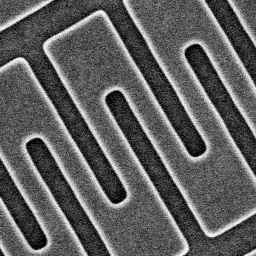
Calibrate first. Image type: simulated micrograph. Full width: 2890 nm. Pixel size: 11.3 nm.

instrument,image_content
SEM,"groups of lines, slits or small figures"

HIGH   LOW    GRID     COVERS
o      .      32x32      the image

oooooo..........oooooooooo...ooo
oooo........o...oooooooooo...ooo
oo........oooo...oooooooooo...oo
o........ooooo...ooooooooooo...o
.......oooooooo...oooooooooo...o
......ooooooooo...oooooo.oooo...
......oooooooooo...oooo...ooo...
..o...ooooooooooo...ooo...oooo..
oooo...oooooooooo...oooo...oooo.
oooo...ooooooooooo...ooo...oooo.
ooooo...oooooooooo...oooo...oooo
oooooo...ooooo.oooo...oooo...ooo
oooooo...oooo...oooo...ooo...ooo
ooooooo...oooo..oooo...oooo...oo
ooooooo...oooo...oooo...ooo...oo
oooooooo...oooo...ooo...oooo...o
oooooooo...oooo...oooo...ooo....
oooo.oooo...oooo...oooo..oooo...
ooo...oooo...ooo...oooo...oooo..
oooo...ooo...oooo...oooo.ooooo..
.ooo...oooo...oooo...oooooooooo.
.oooo...oooo..oooo...ooooooooooo
..ooo...oooo...oooo...oooooooooo
..oooo...oooo...ooo...oooooooooo
...oooo...ooo...oooo...ooooooooo
o..oooo...ooooooooooo...oooooooo
o...oooo...oooooooooo...oooooooo
oo...ooo...ooooooooooo...oooooo.
oo...oooo...oooooooooo...oooo...
ooo...oooo...oooooooooo...o.....
oooo..oooo...oooooooooo.........
ooooooooooo...ooooooooo........o